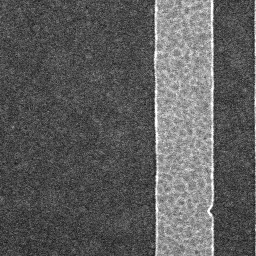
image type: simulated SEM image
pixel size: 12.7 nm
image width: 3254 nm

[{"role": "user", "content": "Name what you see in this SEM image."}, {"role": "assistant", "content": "one or a few lines or trenches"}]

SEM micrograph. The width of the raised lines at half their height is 704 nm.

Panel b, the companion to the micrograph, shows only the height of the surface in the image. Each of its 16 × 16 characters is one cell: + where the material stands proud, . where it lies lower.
..........+++...
..........+++...
..........+++...
..........+++...
..........+++...
..........+++...
..........+++...
..........+++...
..........+++...
..........+++...
..........+++...
..........+++...
..........+++...
..........+++...
..........+++...
..........+++...